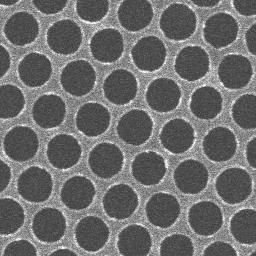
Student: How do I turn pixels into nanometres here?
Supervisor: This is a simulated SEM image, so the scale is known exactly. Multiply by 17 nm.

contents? a regular array of holes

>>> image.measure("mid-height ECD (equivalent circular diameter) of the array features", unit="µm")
0.596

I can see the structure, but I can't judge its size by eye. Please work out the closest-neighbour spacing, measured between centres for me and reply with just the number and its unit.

727 nanometres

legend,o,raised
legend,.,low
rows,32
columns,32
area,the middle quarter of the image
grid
.......ooooooooooo.......ooo....
........ooooo..oooo....ooooo....
........ooo......ooooooooooo....
........oo........oooooo.oooo...
........oo........oooo......oooo
.......ooo........ooo........ooo
.......ooo........ooo........ooo
o.....oooo........oo.........ooo
ooooooooooo.......oo.........ooo
oooooooooooo....ooooo........ooo
oooo......ooooooooooo.......ooo.
.ooo.......oooooo..ooo.....ooooo
ooo........oooo......ooooooooooo
ooo.........oo........oooooooooo
ooo........ooo........oooo.....o
ooo........oo.........ooo.......
oooo.......oo.........oo........
.oooo....oooo.........oo........
...ooooooooooo.......ooo........
....ooooooooooo.....oooo........
....oooo.....oooooooooooo.......
....ooo.......oooooooooooo.....o
....oo.........oooo.....oooo.ooo
....oo.........ooo.......ooooooo
....oo.........oo........oooo...
..oooo.........oo........ooo....
ooooooo.......ooo.........oo....
ooooooo......oooo........oo.....
o.....ooo...oooooo.......oo.....
.......oooooooooooo.....oooo....
........oooo....oooooooooooo....
........ooo......oooooooooooo...